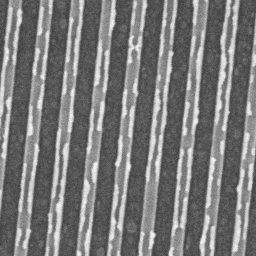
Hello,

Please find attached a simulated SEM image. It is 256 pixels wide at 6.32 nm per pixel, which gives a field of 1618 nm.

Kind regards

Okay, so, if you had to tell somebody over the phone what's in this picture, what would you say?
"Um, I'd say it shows parallel lines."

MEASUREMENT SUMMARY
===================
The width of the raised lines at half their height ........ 77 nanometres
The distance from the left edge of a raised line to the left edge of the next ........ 195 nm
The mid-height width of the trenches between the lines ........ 0.118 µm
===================